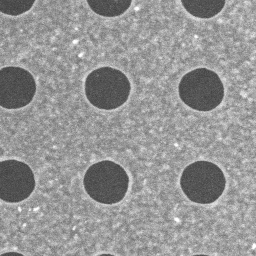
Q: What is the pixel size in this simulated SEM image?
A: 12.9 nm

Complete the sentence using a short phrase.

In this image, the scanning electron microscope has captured holes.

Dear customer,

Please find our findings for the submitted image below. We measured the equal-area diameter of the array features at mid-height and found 579 nm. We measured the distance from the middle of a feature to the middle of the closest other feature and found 93.3 px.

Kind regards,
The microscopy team